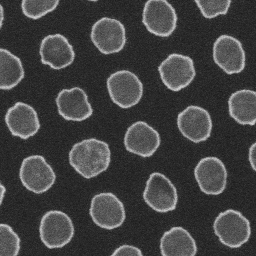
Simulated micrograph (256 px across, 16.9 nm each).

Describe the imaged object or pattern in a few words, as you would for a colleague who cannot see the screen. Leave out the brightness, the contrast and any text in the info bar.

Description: a regular array of raised bodies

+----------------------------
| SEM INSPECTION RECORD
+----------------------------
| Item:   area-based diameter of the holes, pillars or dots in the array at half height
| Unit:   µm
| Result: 0.581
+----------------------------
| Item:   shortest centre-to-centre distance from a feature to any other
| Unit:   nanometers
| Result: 914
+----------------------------